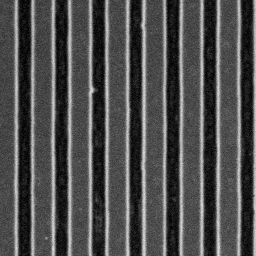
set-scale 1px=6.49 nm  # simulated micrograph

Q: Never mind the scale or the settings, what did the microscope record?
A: parallel lines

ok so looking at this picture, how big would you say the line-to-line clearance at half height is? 0.0941 micrometres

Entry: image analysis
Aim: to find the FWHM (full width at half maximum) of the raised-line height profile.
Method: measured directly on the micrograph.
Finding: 22.2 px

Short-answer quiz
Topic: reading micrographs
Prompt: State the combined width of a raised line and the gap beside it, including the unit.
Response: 0.241 micrometres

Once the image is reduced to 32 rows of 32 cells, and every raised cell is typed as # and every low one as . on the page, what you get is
##..###..##..###..###..##..###..
##..###..##..###..###..##..###..
##..###..##..###..###..##..###..
##..###..##..###..###..##..###..
##..###..##..###..###..##..###..
##..###..##..###..###..##..###..
##..###..##..###..###..##..###..
##..###..##..###..###..##..###..
##..###..##..###..###..##..###..
##..###..##..###..###..##..###..
##..###..##..###..###..##..###..
##..###..##..###..###..##..###..
##..###..##..###..###..##..###..
##..###..##..###..###..##..###..
##..###..##..###..###..##..###..
##..###..##..###..###..##..###..
##..###..##..###..###..##..###..
##..###..##..###..###..##..###..
##..###..##..###..###..##..###..
##..###..##..###..###..##..###..
##..###..##..###..###..##..###..
##..###..##..###..###..##..###..
##..###..##..###..###..##..###..
##..###..##..###..###..##..###..
##..###..##..###..###..##..###..
##..###..##..###..###..##..###..
##..###..##..###..###..##..###..
##..###..##..###..###..##..###..
##..###..##..###..###..##..###..
##..###..##..###..###..##..###..
##..###..##..###..###..##..###..
##..###..##..###..###..##..###..